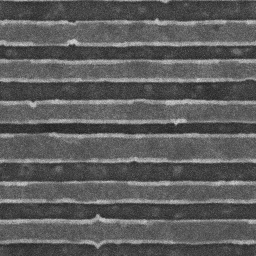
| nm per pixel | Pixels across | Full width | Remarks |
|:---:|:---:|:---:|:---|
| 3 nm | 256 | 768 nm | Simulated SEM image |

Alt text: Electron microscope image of parallel lines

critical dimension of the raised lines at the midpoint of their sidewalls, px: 22.9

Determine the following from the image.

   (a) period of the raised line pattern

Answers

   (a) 119 nanometres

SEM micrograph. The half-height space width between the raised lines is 54.1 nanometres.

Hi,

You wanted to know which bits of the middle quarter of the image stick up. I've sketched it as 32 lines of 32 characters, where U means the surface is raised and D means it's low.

UUUUUUUUUUUUUUUUUUUUUUUUUUUUUUUU
UUUUUUUUUUUUUUUUUUUUUUUUUUUUUUUU
UUUUUUUUUUUUUUUUUUUUUUUUUUUUUUUU
UUUUUUUUUUUUUUUUUUUUUUUUUUUUUUUU
DDDDDDDDDDDDDDDDDDDDDDDDDDDDDUDD
DDDDDDDDDDDDDDDDDDDDDDDDDDDDDDDD
DDDDDDDDDDDDDDDDDDDDDDDDDDDDDDDD
DDDDDDDDDDDDDDDDDDDDDDDDDDDDDDDD
DDDDDDDDDDDDDDDDDDDDDDDDDDDDDDDD
UUUUUUUUUUUUUUUUUUUUUUUUUUUUUUUU
UUUUUUUUUUUUUUUUUUUUUUUUUUUUUUUU
UUUUUUUUUUUUUUUUUUUUUUUUUUUUUUUU
UUUUUUUUUUUUUUUUUUUUUUUUUUUUUUUU
UUUUUUUUUUUUUUUUUUUUUUUUUUUUUUUU
UUDDUUUUUUUUUUUUUUUUUUUUUUUUUUUU
DDDDDDDDDDDDDDDDDDDDDDDDDDDDDDDD
DDDDDDDDDDDDDDDDDDDDDDDDDDDDDDDD
DDDDDDDDUUUUUUUDDDDDDDDDDDDDUDDU
UUUUUUUUUUUUUUUUUUUUUUUUUUUUUUUU
UUUUUUUUUUUUUUUUUUUUUUUUUUUUUUUU
UUUUUUUUUUUUUUUUUUUUUUUUUUUUUUUU
UUUUUUUUUUUUUUUUUUUUUUUUUUUUUUUU
UUUUUUUUUUUUUUUUUUUUUUUUUUUUUUUU
UUUUUUUUUUUUUUUUUUUUUUUUUUUUUUUU
DDDDDDDDDUUUDDDDDDDDDDDDDDDDDDDD
DDDDDDDDDDDDDDDDDDDDDDDDDDDDDDDD
DDDDDDDDDDDDDDDDDDDDDDDDDDDDDDDD
DDDDDDDDDDDDDDDDDDDDDDDDDDDDDDDD
DDDDDDDDDDDDDDDDDDDDDDDDDDDDDDDD
DDDDDUUUDDDDDDUUUUUDDDDUUUUDDDDD
UUUUUUUUUUUUUUUUUUUUUUUUUUUUUUUU
UUUUUUUUUUUUUUUUUUUUUUUUUUUUUUUU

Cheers